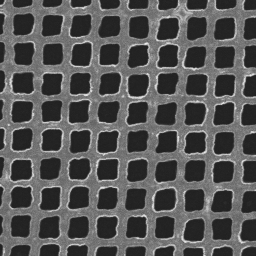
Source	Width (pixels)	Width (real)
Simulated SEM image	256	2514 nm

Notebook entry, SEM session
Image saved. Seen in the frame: a regular array of holes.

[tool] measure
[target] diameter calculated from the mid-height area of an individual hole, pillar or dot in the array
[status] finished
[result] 0.221 um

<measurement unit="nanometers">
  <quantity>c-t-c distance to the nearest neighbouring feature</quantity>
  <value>276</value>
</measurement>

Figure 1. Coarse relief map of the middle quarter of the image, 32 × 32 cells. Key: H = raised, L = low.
HHHLLHHHHHHHHHHHLLLLHHHHLLLLHHLL
HHHHHHHHHHHHHHHHHHHHHHHHHHHHHHHH
HHLLLLHHHHLLLLHHHHHHHHHHLLLLHHHH
HHLLLLLHHLLLLLHHLLLLLHHLLLLLLHHL
HLLLLLHHHLLLLLHHLLLLLHHLLLLLHHHL
HLLLLLLHHLLLLLHHLLLLLHHLLLLLHHHL
HLLLLLHHHLLLLLHHLLLLLHHLLLLLHHHL
HHLLLHHHHLLLHHHHLLLLLHHHLLLHHHHL
HHHHHHHHHHHHHHHHHHHHHHHHHHHHHHHH
HHHLLLHHHHLLLLHHHHHHHHHHHHHLHHHH
HLLLLLHHHLLLLLHHLLLLLHHHLLLLHHLL
HLLLLLHHHLLLLLHHLLLLLHHLLLLLHHLL
HLLLLLHHLLLLLLHHLLLLHHHLLLLLHHLL
HLLLLLHHHLLLLHHHLLLLLHHLLLLLHHLL
HLLLLLHHHLLLHHHHLLLLHHHLLLLLHHLL
HHHHHHHHHHHHHHHHHHHHHHHHHHHHHHHH
HHHHHHHHHHHHHHHHHHHHHHHHHHHHHHHH
HHLLLLLHHLLLLLHHLLLLLHHHLLLLHHHL
HLLLLLLHLLLLLHHHLLLLLHHLLLLLHHLL
HHLLLLLHLLLLLHHHLLLLLHHHLLLLHHLL
HHLLLLHHLLLLLHHHLLLLLHHLLLLLHHLL
HLLLLLHHLLLLLHHHLLLLLHHLLLLLHHLL
HHHHHHHHHHHHHHHHHHHHHHHHHHHHHHHH
HHHHHHHHHHHHHHHHHHHHHHHHHHHHHHHH
HLLLLLHHHLLLLLHHLLLLLHHHLLLLHHHL
HLLLLLLHHLLLLHHHLLLLLHHLLLLLHHLL
HLLLLLLHLLLLLLHHLLLLLHHLLLLLHHLL
HLLLLLHHLLLLLLHHLLLLLHHLLLLLHHLL
HHLLLLHHHLLLLHHHLLLLHHHLLLLLHHLL
HHHHHHHHHHHHHHHHHHHHHHHLLHHHHHHH
HHHHLHHHHHHHHHHHHHHHHHHHHHHHHHHH
HHLLLLHHHLLLLHHHLLLLHHHHHLLHHHHL